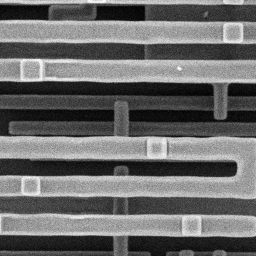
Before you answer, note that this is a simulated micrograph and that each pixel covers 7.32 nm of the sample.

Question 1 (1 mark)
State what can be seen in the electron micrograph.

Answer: wiring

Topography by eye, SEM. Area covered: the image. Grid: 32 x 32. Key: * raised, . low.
.........................***.***
................................
................................
********************************
********************************
................................
................................
***********.....................
********************************
********************************
................................
................................
................................
................................
................................
................................
................................
********************************
********************************
********************************
..............................**
..............................**
********************************
********************************
********************************
................................
................................
********************************
********************************
.....................***********
................................
................................